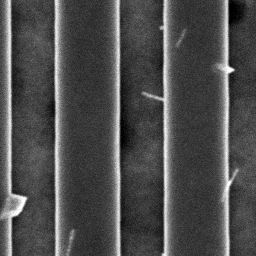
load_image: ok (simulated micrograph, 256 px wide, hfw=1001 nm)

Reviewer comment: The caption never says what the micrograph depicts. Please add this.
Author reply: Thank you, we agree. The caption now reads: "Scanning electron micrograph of wiring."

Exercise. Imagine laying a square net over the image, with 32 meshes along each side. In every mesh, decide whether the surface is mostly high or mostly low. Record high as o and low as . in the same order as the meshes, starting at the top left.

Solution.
o......oooooooo......ooooooo....
o......oooooooo......ooooooo....
o......oooooooo......ooooooo....
o......oooooooo......ooooooo....
o......oooooooo......ooooooo....
o......oooooooo......ooooooo....
o......oooooooo......ooooooo....
o......oooooooo......ooooooo....
o......oooooooo......oooooooo...
o......oooooooo......oooooooo...
o......oooooooo......ooooooo....
o......oooooooo......ooooooo....
o......oooooooo.....ooooooooo...
o......oooooooo......oooooooo...
o......oooooooo......ooooooo....
o......oooooooo......ooooooo....
o......oooooooo......ooooooo....
o......oooooooo......ooooooo....
o......oooooooo......ooooooo....
o......oooooooo......ooooooo....
o......oooooooo......ooooooo....
o......oooooooo......ooooooo....
o......oooooooo......oooooooo...
o......oooooooo......oooooooo...
ooo....oooooooo......ooooooo....
ooo....oooooooo......ooooooo....
oo.....oooooooo......ooooooo....
o......oooooooo......oooooooo...
o......oooooooo......ooooooo....
o......oooooooo......oooooooo...
o......oooooooo......oooooooo...
o......oooooooo......oooooooo...